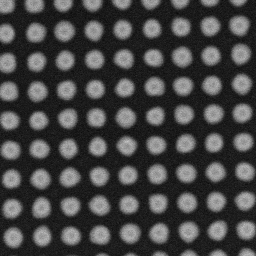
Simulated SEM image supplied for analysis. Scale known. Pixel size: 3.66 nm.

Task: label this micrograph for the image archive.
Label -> an array of small figures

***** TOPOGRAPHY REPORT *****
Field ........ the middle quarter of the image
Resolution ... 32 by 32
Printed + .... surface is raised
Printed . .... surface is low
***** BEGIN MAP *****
++....+++.....+++.....++....+++.
+...............................
................................
......................++.....++.
++....+++.....+++....++++..+++++
+++...++++...++++...+++++..+++++
+++...++++...++++...+++++...++++
+++...++++...++++....++++...+++.
++.....++.......................
................................
.............................++.
++.....++.....+++.....+++...++++
+++...++++...+++++...++++...++++
+++...++++...+++++...++++...++++
+++...++++...+++++...++++...+++.
+++....+++....+++...............
................................
................................
.......++.....+++....+++.....+++
+++....+++...+++++...++++...++++
+++...+++++..+++++...++++...++++
+++...+++++...++++...++++...++++
+++....+++.....++.....++........
++..............................
................................
......................+++....+++
+++....++++...++++...++++...++++
++++...++++...++++...+++++..++++
++++...++++...++++...+++++...+++
++++...++++...++++....+++.....++
++..............................
................................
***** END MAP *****